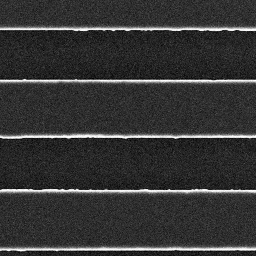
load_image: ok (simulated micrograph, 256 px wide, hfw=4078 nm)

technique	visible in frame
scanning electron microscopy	lines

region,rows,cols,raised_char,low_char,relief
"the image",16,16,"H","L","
HHHHHHHHHHHHHHHH
HHHHHHHHHHHHHHHH
LLLLLLLLLLLLLLLL
LLLLLLLLLLLLLLLL
LLLLLLLLLLLLLLLL
HHHHHHHHHHHHHHHH
HHHHHHHHHHHHHHHH
HHHHHHHHHHHHHHHH
HHHHHHHHHHHHHHHH
LLLLLLLLLLLLLLLL
LLLLLLLLLLLLLLLL
LLLLLLLLLLLLLLLL
HHHHHHHHHHHHHHHH
HHHHHHHHHHHHHHHH
HHHHHHHHHHHHHHHH
HHHHHHHHHHHHHHHH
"